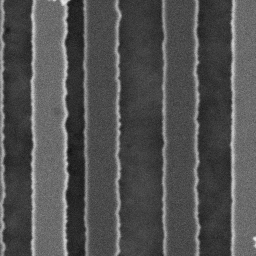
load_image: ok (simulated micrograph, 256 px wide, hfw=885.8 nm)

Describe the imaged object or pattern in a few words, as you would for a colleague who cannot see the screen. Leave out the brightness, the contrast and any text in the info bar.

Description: lines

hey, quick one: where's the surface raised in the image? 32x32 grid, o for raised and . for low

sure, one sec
....oooo..ooooo.....ooooo....ooo
....oooo..ooooo.....ooooo....ooo
....oooo...oooo.....ooooo....ooo
....oooo...oooo.....ooooo....ooo
....oooo...oooo......oooo....ooo
....oooo...oooo.....ooooo....ooo
....oooo...oooo.....ooooo....ooo
....oooo..ooooo.....ooooo....ooo
....oooo..ooooo.....ooooo....ooo
....oooo...oooo.....ooooo....ooo
....oooo..ooooo.....ooooo....ooo
....oooo...oooo.....ooooo....ooo
....oooo...oooo.....ooooo....ooo
....oooo...oooo.....ooooo....ooo
....oooo...oooo.....ooooo....ooo
....oooo...oooo.....ooooo....ooo
....oooo..ooooo.....ooooo....ooo
....oooo...oooo.....ooooo....ooo
....oooo...oooo.....ooooo....ooo
o...oooo...oooo.....ooooo....ooo
....oooo...oooo.....ooooo....ooo
....oooo...oooo.....ooooo....ooo
....oooo...oooo.....ooooo....ooo
o...oooo...oooo.....ooooo....ooo
o...oooo...oooo.....ooooo....ooo
....oooo...oooo.....ooooo....ooo
....oooo...oooo.....ooooo....ooo
....oooo...oooo.....ooooo....ooo
....oooo...oooo.....ooooo....ooo
....oooo...oooo......oooo....ooo
o...oooo...oooo.....ooooo....ooo
o...oooo...oooo.....ooooo....ooo